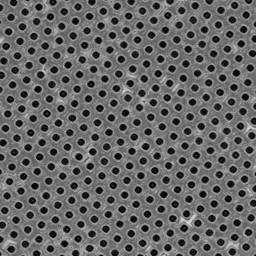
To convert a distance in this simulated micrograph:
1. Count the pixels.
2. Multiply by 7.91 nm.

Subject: a regular array of holes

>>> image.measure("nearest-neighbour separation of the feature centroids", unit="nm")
115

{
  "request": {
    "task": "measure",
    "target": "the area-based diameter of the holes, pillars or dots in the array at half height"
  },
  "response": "0.0592 µm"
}